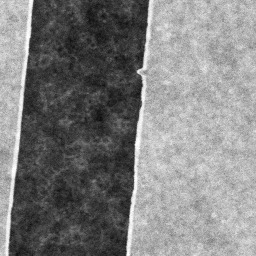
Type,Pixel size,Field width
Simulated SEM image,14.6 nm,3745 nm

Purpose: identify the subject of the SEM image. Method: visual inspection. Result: one or a few lines or trenches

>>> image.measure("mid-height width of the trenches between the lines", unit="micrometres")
1.76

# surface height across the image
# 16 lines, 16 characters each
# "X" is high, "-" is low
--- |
XX-------XXXXXXX
XX-------XXXXXXX
XX-------XXXXXXX
XX-------XXXXXXX
X--------XXXXXXX
X--------XXXXXXX
X--------XXXXXXX
X--------XXXXXXX
X--------XXXXXXX
X--------XXXXXXX
X--------XXXXXXX
X-------XXXXXXXX
X-------XXXXXXXX
X-------XXXXXXXX
--------XXXXXXXX
--------XXXXXXXX